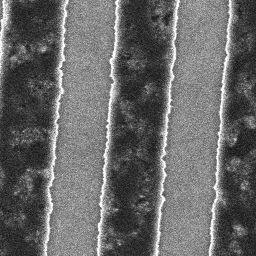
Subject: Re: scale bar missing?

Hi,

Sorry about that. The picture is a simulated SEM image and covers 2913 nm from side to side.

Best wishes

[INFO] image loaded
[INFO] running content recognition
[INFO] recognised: one or a few lines or trenches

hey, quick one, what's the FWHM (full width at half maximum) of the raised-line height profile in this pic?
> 59.6 px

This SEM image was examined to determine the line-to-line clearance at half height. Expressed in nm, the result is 583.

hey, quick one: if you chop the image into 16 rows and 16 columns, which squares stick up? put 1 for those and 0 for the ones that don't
1111000111100011
1111000111100011
1111000111100011
1111000111100011
1111000111100011
1111000111100011
1111000111100011
1111000111000011
1111000111000011
1110000111000011
1110000111000011
1110001111000011
1110001111000111
1110001111000111
1110001111000111
1110001111000111